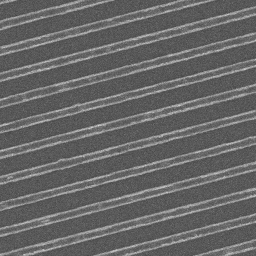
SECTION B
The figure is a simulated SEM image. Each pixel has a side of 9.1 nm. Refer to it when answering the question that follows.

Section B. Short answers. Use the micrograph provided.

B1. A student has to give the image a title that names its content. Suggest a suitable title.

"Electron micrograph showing parallel lines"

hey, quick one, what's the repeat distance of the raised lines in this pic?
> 228 nm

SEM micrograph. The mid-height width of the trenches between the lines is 151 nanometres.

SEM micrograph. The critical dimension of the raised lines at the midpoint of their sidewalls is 0.0715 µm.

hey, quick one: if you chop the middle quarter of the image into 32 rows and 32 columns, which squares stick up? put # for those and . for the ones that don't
...............#########........
............########............
........########................
....########.................###
#########................#######
#####.................########..
#.................########......
..............########..........
..........########..............
......########.................#
..#########................#####
######.................########.
###.................#######.....
................#######.........
............#######.............
........########................
....########.................###
########.................#######
####..................#######...
..................#######.......
..............#######...........
..........########..............
......########.................#
..########.................#####
######.................########.
##.................########.....
...............########.........
............########............
.......########.................
...########..................###
########.................#######
####................########....